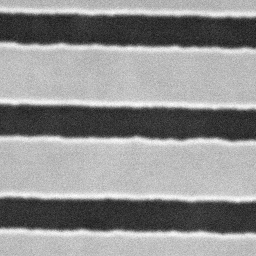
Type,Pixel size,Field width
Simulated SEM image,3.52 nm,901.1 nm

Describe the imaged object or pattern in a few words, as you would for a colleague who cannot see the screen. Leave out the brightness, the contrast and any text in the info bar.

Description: lines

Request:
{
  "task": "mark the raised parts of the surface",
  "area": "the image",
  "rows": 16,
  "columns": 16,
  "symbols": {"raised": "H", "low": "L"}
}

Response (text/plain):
HHHHHHHHHHHHHHHH
LLLLLLLLLLLLLLLL
LLLLLLLLLLLLLLLL
HHHHHHHHHHHHHHHH
HHHHHHHHHHHHHHHH
HHHHHHHHHHHHHHHH
LLHHHHHHHHHHHHHH
LLLLLLLLLLLLLLLL
LLLLLLLLLLLLLLLL
HHHHHHHHHHHHHHHH
HHHHHHHHHHHHHHHH
HHHHHHHHHHHHHHHH
LLLLLLLLLLLLHLHH
LLLLLLLLLLLLLLLL
HHHHHHLHLLLLLLLL
HHHHHHHHHHHHHHHH